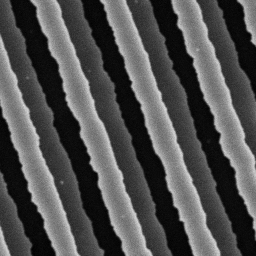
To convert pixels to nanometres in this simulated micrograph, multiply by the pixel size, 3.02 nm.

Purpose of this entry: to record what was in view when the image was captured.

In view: lines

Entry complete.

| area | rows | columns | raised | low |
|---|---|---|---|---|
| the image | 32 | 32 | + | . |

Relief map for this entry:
+...++++++...++++++..++++++...++
++...+++++...++++++...++++++...+
++...++++++..++++++...++++++...+
++...++++++...++++++..++++++...+
+++...+++++...++++++...++++++..+
+++...++++++...++++++..++++++...
+++...+++++++..++++++..+++++++..
++++...++++++...+++++...++++++..
++++...++++++...++++++..++++++..
+++++...++++++..++++++...++++++.
+++++...++++++..+++++++..++++++.
+++++...++++++...++++++..+++++++
++++++..+++++++..++++++...++++++
++++++...++++++...++++++..++++++
+++++++..++++++...++++++...+++++
.++++++...++++++..++++++...+++++
.++++++...++++++...+++++...+++++
.++++++...++++++...++++++..+++++
..++++++...++++++..++++++...++++
..++++++...++++++...++++++..++++
...++++++..++++++...++++++...+++
...++++++...++++++...+++++...+++
...+++++++..++++++...++++++..+++
+...++++++..+++++++..++++++...++
+...++++++...++++++..++++++...++
++..++++++...++++++...++++++...+
++...++++++...+++++...++++++...+
++...++++++...++++++...++++++...
+++...++++++..++++++...++++++...
+++...++++++...++++++..++++++...
++++..++++++...++++++...++++++..
++++...++++++..++++++...++++++..